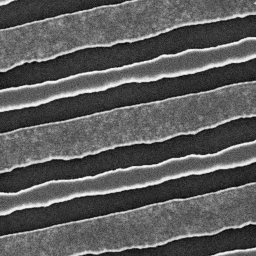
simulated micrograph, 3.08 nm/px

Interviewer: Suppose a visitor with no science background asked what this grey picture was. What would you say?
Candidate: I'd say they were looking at lines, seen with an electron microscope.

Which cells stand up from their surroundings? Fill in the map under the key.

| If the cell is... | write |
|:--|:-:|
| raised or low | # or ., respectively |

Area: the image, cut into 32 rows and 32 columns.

#..............#################
..........######################
.....#######################....
.#####################..........
###################.............
##############...............###
#########..............#########
######.............############.
#.............############......
.........############...........
.....##########...............##
###########...............######
#######.............############
###............#################
...........#####################
......######################....
.########################.......
#####################...........
##############..............####
###########............#########
####................###########.
#............#############......
.........############...........
....#############............###
##########...............#######
######..............############
##..............################
...........#####################
......#######################...
########################........
####################............
#############................###